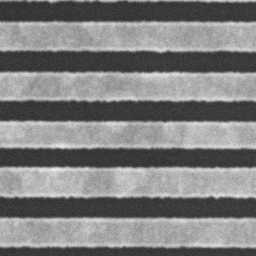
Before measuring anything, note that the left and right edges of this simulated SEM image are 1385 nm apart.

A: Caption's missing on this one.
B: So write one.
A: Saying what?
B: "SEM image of lines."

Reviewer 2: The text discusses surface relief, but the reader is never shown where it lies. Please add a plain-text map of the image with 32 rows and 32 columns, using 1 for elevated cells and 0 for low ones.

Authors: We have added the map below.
00000000000000000000000000000000
00000000000000000000000000000000
00000000000000000000000000000000
11111111111111111111111111111111
11111111111111111111111111111111
11111111111111111111111111111111
00000000000000000000000000000000
00000000000000000000000000000000
00000000000000000000000000000000
11111111111111111111111111111111
11111111111111111111111111111111
11111111111111111111111111111111
11100010101111100101011111111111
00000000000000000000000000000000
00000000000000000000000000000000
11111111111111111111111111111111
11111111111111111111111111111111
11111111111111111111111111111111
00000000000000000000000100010101
00000000000000000000000000000000
00000000000000000000000000000000
11111111111111111111111111111111
11111111111111111111111111111111
11111111111111111111111111111111
11111111111111111111111111111111
00000000000000000000000000000000
00000000000000000000000000000000
11111111111111111111111111111111
11111111111111111111111111111111
11111111111111111111111111111111
11111111111111111111111111111111
00000000000000000000000000000000